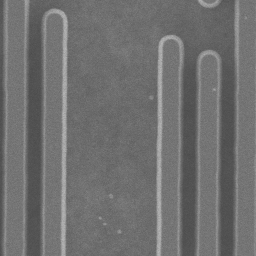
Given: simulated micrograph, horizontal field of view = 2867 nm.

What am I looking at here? groups of lines, slits or small figures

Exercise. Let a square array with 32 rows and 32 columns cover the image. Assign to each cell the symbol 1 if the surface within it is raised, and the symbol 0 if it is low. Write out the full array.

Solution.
01100000000000000000000000100011
01100010000000000000000000000011
01100011000000000000000000000011
01100111000000000000000000000011
01100111000000000000000000000011
01100111000000000000111000000011
01100111000000000000111000000011
01100111000000000000111001100011
01100111000000000000111001100011
01100011000000000000111001100011
01100011000000000000111001100011
01100011000000000000111001100111
01100111000000000000111001100111
01100111000000000000111001100011
01100111000000000000111001100011
01100111000000000000111001100111
01100111000000000000111001100111
01100111000000000000111001100111
01100111000000000000111001100111
01100111000000000000111001100111
01100111000000000000111001100111
01100111000000000000111001100111
01100111000000000000111001100111
01100111000000000000111001100111
01100111000000000000111001100111
01100111000000000000111001100111
01100111000000000000111001100111
11100111000000000000111001100111
11100111000000000000111001100111
11100111000000000000111001100111
11100111000000000000110001100111
11100111000000000000110001100111